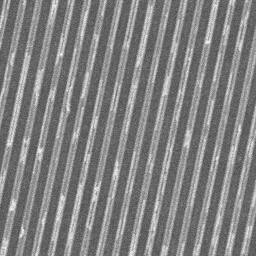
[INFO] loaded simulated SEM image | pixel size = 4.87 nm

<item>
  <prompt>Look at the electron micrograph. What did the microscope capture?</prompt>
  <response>parallel lines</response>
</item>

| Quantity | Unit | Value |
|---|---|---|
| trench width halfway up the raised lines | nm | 48.2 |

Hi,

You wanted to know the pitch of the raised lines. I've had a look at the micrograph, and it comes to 0.0767 µm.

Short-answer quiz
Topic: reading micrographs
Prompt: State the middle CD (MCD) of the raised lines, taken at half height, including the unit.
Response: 26.8 nanometres